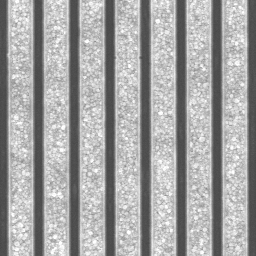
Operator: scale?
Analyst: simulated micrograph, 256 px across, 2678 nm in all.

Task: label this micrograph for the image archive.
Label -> parallel lines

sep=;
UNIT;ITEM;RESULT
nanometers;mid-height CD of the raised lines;263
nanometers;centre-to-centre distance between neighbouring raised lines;373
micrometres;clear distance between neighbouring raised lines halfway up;0.103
